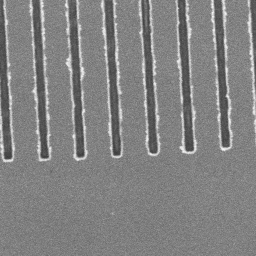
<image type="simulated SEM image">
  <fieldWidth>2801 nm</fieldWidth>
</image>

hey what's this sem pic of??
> parallel lines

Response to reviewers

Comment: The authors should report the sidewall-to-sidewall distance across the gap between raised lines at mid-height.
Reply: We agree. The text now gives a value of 95.5 nanometres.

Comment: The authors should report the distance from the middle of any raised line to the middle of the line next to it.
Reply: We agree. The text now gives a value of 397 nm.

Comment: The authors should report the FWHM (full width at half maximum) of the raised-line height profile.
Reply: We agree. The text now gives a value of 306 nm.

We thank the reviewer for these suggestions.